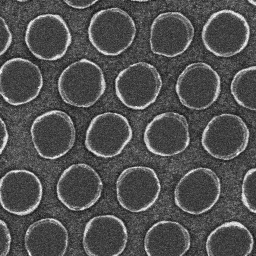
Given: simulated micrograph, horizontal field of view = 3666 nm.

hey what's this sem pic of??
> a regular array of raised bodies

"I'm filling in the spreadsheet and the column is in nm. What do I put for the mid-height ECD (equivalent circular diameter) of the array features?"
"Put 640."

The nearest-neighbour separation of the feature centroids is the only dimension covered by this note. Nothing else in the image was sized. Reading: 820 nanometres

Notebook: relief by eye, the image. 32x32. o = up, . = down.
.........ooo....................
............oooo...........oo...
....oooo....oooo...ooooo..ooooo.
o...oooo...oooooo..ooooo..ooooo.
o..oooooo..oooooo..ooooo.oooooo.
o..ooooo....oooo...ooooo..ooooo.
....oooo.....oo....oooo....ooo..
.oo.............................
ooooo...oooo....ooo....ooo......
ooooo...ooooo..ooooo..ooooo..ooo
ooooo..oooooo..ooooo..ooooo..ooo
ooooo..oooooo..ooooo..ooooo..ooo
.ooo....oooo...oooo....oooo...oo
........................oo.....o
.....oooo...ooo.....ooo....ooo..
o...ooooo..ooooo...oooo...ooooo.
o...ooooo..ooooo..ooooo...ooooo.
o...ooooo..ooooo..ooooo..oooooo.
.....oooo..oooo....oooo...ooooo.
.....ooo.....o.............oo...
................................
.ooo....oooo...oooo.....ooo....o
ooooo..oooooo..ooooo...oooo....o
ooooo..oooooo..ooooo..ooooo...oo
ooooo..ooooo...ooooo..ooooo...oo
ooooo...oooo...oooo...ooooo....o
.oo....................oo.......
.....oo.....ooo.................
o...oooo...ooooo...oooo....oooo.
o..ooooo...ooooo..oooooo..ooooo.
o..ooooo..oooooo..oooooo..oooooo
o...oooo...oooo...ooooo...ooooo.